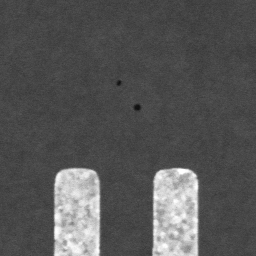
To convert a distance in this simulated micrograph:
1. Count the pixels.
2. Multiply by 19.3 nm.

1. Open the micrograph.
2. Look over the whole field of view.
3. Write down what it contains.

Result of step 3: wiring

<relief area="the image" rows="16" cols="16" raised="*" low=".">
................
................
................
................
................
................
................
................
................
................
................
....**....**....
....**....**....
....**....**....
....**....**....
....**....**....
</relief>